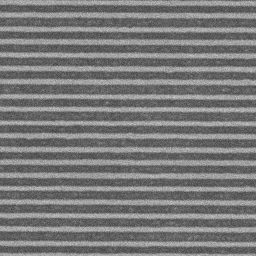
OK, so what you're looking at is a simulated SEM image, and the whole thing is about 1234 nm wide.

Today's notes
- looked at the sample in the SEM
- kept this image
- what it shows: parallel lines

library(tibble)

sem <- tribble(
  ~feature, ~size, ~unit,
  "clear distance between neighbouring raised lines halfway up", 0.0416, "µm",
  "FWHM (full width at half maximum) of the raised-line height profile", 21.1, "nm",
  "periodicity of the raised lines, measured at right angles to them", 64.7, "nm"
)